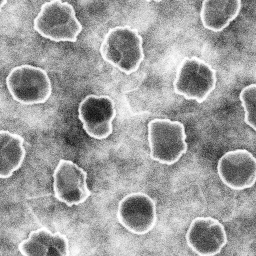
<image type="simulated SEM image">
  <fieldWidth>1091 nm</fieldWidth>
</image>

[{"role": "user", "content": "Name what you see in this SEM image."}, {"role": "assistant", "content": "raised bodies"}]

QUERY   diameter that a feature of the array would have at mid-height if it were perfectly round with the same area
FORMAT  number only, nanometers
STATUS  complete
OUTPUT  167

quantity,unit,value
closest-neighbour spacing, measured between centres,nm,306